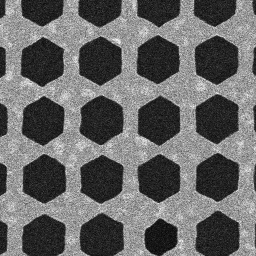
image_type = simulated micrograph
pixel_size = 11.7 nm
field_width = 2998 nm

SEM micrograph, a regular array of holes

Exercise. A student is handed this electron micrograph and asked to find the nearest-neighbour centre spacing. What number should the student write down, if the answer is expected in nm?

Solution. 674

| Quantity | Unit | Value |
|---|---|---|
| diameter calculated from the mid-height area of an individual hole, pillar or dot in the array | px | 45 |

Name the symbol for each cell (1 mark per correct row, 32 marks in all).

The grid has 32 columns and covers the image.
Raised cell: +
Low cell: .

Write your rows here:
.++.....++.....++......+.....++.
.++.....++.....++.....++.....+++
++++...++++...++++....+++...++++
++++++++++++++++++++++++++++++++
++++++++++++++++++++++++++++++++
++++...++++...++++....+++....+++
.++.....++.....++.....++......++
.++.....++.....++.....++......++
.++.....++.....++.....++......++
+++.....++.....++....++++....+++
+++++.++++++.+++++++++++++++++++
++++++++++++++++++++++++++++++++
+++++.+++++...+++++..+++++...+++
.++.....++.....+++....+++.....++
.++.....++.....++......+......++
.++.....++.....++......++.....++
.++.....++.....++.....+++....+++
++++...++++...+++++..+++++..++++
++++++++++++++++++++++++++++++++
+++++.+++++++++++++.++++++..++++
++++....+++....+++....+++.....++
.++.....++.....++......++.....++
.++.....++.....++......++.....++
.++.....++.....++.....++......++
++++...++++....+++...+++++..++++
++++++++++++++++++++++++++++++++
+++++++++++++++++++++++++++.++++
++++...++++...+++++++++++....+++
.++.....++.....++++...+++.....++
.++.....++......++....+++.....++
.++.....++......++....++......++
.++.....++.....++++..++++....+++